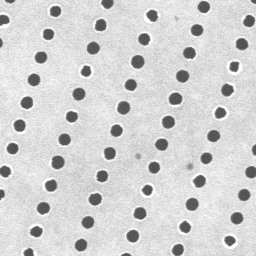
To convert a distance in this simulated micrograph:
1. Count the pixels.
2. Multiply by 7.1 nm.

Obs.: a regular array of holes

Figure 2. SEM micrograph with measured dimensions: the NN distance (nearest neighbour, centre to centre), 169 nanometers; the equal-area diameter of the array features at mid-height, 89.9 nm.